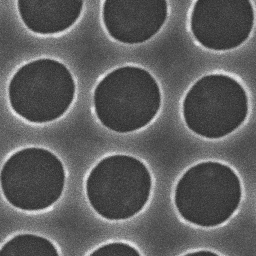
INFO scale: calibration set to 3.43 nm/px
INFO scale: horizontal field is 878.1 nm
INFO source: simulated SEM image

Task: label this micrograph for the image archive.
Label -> holes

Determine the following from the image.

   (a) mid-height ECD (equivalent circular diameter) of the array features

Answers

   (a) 225 nm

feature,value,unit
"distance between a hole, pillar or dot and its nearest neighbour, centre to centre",302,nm